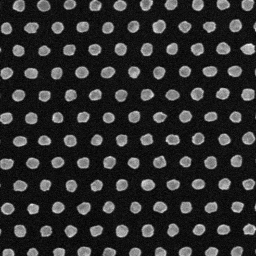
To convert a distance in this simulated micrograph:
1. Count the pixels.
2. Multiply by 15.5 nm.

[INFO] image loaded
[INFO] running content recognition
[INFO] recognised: a regular array of raised bodies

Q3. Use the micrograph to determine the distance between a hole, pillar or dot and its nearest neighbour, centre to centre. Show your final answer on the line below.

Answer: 388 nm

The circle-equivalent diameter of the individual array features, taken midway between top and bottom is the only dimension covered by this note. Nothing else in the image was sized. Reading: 0.176 micrometres